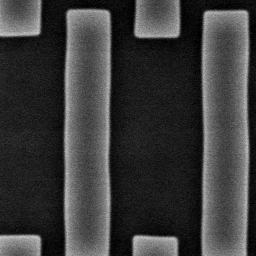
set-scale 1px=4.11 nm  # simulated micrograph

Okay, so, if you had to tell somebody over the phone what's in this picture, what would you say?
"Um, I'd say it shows groups of lines, slits or small figures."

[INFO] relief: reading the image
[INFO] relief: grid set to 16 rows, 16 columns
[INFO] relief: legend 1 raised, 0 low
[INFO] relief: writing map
1100000001100000
1100111011100110
0000111000000111
0000111000000111
0000111000000110
0000111000000110
0000111000000110
0000111000000110
0000111000000110
0000111000000110
0000111000000110
0000111000000110
0000111000000110
0000111000000110
0000111000000110
1100111011100110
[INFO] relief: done